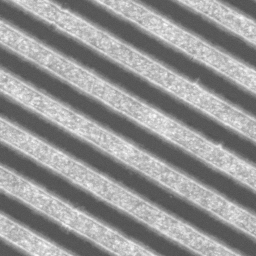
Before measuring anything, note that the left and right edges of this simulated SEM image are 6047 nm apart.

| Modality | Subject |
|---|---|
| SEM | parallel lines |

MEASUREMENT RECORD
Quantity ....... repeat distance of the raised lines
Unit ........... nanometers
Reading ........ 989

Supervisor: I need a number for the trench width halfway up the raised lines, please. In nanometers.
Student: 483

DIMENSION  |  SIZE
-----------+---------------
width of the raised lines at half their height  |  504 nm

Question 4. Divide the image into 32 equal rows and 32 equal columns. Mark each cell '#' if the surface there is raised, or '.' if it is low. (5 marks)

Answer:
..#####.....######.....#####....
....#####.....#####......#####..
.....######.....#####.....######
##.....#####......#####.....####
###......#####.....######.....##
#####......#####.....#####......
..#####.....######.....#####....
...######.....#####......#####..
.....######.....#####.....#####.
##.....#####......#####.....####
###......#####.....######.....##
#####.....######.....#####.....#
..#####.....#####......#####....
...######.....#####.....######..
.....#####......#####.....######
##.....#####.....######.....####
###......#####.....######.....##
#####.....######.....#####.....#
..#####.....#####......#####....
...######.....#####.....######..
.....######.....#####.....#####.
##.....#####.....#####......####
####.....#####.....#####......##
#####.....######.....#####.....#
.######.....#####......#####....
...######.....#####.....#####...
.....#####......#####.....#####.
##.....#####.....######.....####
###.....######.....#####......##
#####.....######.....#####.....#
.######.....#####......#####....
...#####......#####.....#####...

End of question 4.